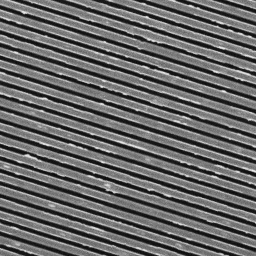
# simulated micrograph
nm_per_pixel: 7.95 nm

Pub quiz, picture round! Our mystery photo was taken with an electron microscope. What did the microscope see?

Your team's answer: parallel lines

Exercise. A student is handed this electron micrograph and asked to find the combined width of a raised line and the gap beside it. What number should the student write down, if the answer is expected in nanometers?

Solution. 95.4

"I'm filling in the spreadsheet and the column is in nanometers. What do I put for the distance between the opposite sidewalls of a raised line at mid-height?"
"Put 64.6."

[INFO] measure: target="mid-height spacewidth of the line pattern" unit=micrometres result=0.0294